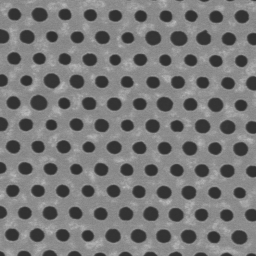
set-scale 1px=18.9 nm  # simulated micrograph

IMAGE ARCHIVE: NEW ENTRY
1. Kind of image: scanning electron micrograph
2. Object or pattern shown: a regular array of holes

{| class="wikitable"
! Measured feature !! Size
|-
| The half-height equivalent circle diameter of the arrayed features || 253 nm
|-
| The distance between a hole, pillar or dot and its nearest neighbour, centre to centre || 0.47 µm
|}